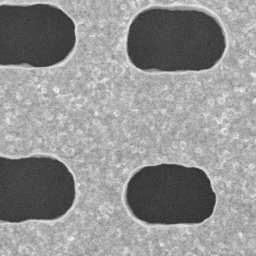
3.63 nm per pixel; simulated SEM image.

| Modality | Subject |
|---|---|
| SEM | holes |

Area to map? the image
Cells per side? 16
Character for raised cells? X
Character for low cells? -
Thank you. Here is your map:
----XXXXX---XXXX
-----XXX------XX
-----XXX------XX
----XXXX------XX
XXXXXXXXXX-XXXXX
XXXXXXXXXXXXXXXX
XXXXXXXXXXXXXXXX
XXXXXXXXXXXXXXXX
XXXXXXXXXXXXXXXX
XXXXXXXXXXXXXXXX
----XXXXX---XXXX
-----XXX-----XXX
-----XXX-----XXX
----XXXX-----XXX
XXXXXXXXXXXXXXXX
XXXXXXXXXXXXXXXX